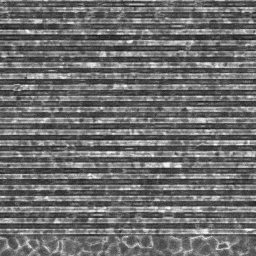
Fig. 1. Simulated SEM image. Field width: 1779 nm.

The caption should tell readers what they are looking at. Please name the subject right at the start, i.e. parallel lines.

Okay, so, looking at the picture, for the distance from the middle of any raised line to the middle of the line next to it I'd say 77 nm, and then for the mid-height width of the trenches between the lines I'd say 0.0478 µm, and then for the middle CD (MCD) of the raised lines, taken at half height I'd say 0.0339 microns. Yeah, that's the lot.